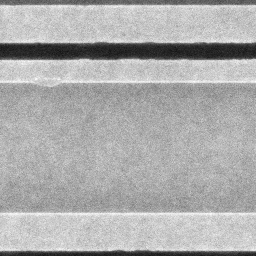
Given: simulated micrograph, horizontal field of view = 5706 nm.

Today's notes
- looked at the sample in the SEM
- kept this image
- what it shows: lines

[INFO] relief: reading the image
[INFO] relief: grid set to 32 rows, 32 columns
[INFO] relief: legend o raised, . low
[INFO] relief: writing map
................................
oooooooooooooooooooooooooooooooo
oooooooooooooooooooooooooooooooo
oooooooooooooooooooooooooooooooo
oooooooooooooooooooooooooooooooo
................................
................................
o........ooo...ooooo..oo.....ooo
oooooooooooooooooooooooooooooooo
oooooooooooooooooooooooooooooooo
.....oo.........................
................................
................................
................................
................................
................................
................................
................................
................................
................................
................................
................................
................................
................................
................................
................................
................................
oooooooooooooooooooooooooooooooo
oooooooooooooooooooooooooooooooo
oooooooooooooooooooooooooooooooo
oooooooooooooooooooooooooooooooo
................................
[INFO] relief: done